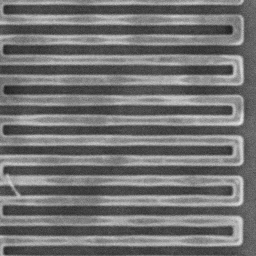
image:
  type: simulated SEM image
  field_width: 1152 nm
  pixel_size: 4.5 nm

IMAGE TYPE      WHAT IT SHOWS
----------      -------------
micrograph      groups of lines, slits or small figures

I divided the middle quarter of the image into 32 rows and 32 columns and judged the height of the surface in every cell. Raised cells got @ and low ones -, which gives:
--------------------------------
--------------------------------
--------------------------------
@@@@@@@@@@@@@@@@@@@@@@@@---@@@@@
@@@@@@@@@@@@@@@@@@@@@@@-----@@@@
--------------------------------
--------------------------------
--------------------------------
@@@@@@@@@@@@@@@@@@@@@@@@@@@@@@@@
@@@@@@@@@@@@@@@@@@@@@@@@@@@@@@@@
--------------------------------
--------------------------------
--------------------------------
@@@@@@@@@@@@@@@@@@@@@@@@@@@@@@@@
@@@@@@@@@@@@@@@@@@@@@@@@@@@@@@@@
--------------------------------
--------------------------------
--------------------------------
@@@@@@@@@@@@@@@@@@@@@@@@@@@@@@@@
@@@@@@@@@@@@@@@@@@@@@@@@@@@@@@@@
--------------------------------
--------------------------------
--------------------------------
@@@@@@@@@@@@@@@@@@@@@@@@@@@@@@@@
@@@@@@@@@@@@@@@@@@@@@@@@@@@@@@@@
--------------------------------
--------------------------------
--------------------------------
@@@@@@@@@@@@@@@@@@@@@@@@@@@@@@@@
@@@@@@@@@@@@@@@@@@@@@@@@@@@@@@@@
--------------------------------
--------------------------------